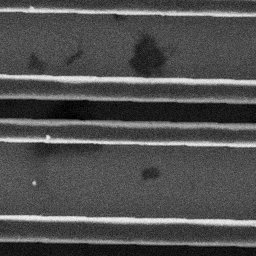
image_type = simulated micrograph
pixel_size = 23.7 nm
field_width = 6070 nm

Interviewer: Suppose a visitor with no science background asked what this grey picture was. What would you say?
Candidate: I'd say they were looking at lines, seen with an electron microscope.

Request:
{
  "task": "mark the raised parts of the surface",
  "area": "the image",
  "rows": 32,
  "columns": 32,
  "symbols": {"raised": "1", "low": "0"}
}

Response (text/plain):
11111111111111111111111111111111
00000111111111111111111111111111
00000000000000000000000000000000
00000000000000000000000000000000
00000000000000000000000000000000
00000000000000000000000000000000
00000000000000000000000000000000
00000000000000000000000000000000
00000000000000000000000000000000
11000000000000000000000000000000
11111111111111111111111111111111
11111111111111111111111111111111
00000000000011111111111111111111
00000000000000000000000000000000
00000000000000000000000000000000
11111111111111111111111111100000
11111111111111111111111111111111
11111111111111111111111111111111
00000000000000000000000000000000
00000000000000000000000000000000
00000000000000000000000000000000
00000000000000000000000000000000
00000000000000000000000000000000
00000000000000000000000000000000
00000000000000000000000000000000
00000000000000000000000000000000
00000000000000000000000000000000
11111111111111110000000000000000
11111111111111111111111111111111
11111111111111111111111111111111
00000000000000000011111111111111
00000000000000000000000000000000